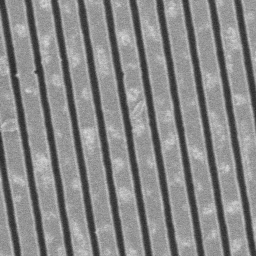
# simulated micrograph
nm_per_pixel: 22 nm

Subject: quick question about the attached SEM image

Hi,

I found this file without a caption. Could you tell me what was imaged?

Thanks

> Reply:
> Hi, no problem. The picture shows parallel lines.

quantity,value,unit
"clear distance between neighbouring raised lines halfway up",196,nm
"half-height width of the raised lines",372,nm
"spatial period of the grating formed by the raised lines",570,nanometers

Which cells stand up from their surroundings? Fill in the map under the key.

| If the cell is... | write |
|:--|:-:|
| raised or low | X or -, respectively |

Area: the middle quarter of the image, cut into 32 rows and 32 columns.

-XXXXX--XXXX---XXXX--XXXX---XXXX
--XXXX--XXXX---XXXX--XXXX---XXXX
--XXXX--XXXX---XXXX--XXXXX--XXXX
--XXXX--XXXXX--XXXX---XXXX--XXXX
--XXXX---XXXX--XXXX---XXXX--XXXX
--XXXX---XXXX--XXXXX--XXXX--XXXX
--XXXXX--XXXX---XXXX--XXXX---XXX
---XXXX--XXXX---XXXX--XXXX---XXX
---XXXX--XXXX---XXXX--XXXXX--XXX
X--XXXX--XXXXX--XXXX---XXXX--XXX
X--XXXX---XXXX--XXXX---XXXX--XXX
X--XXXX---XXXX--XXXXX--XXXX--XXX
X--XXXXX--XXXX---XXXX--XXXX---XX
X---XXXX--XXXX---XXXX--XXXX---XX
XX--XXXX--XXXX---XXXX--XXXXX--XX
XX--XXXX--XXXXX--XXXX--XXXXX--XX
XX--XXXX---XXXX--XXXX---XXXX--XX
XX--XXXX---XXXX--XXXXX--XXXX--XX
XX--XXXXX--XXXX---XXXX--XXXX---X
XX---XXXX--XXXX---XXXX--XXXX---X
XX---XXXX--XXXX---XXXX--XXXXX--X
XXX--XXXX--XXXXX--XXXX---XXXX--X
XXX--XXXX---XXXX--XXXX---XXXX--X
XXX--XXXX---XXXX--XXXXX--XXXX--X
XXX--XXXXX--XXXX---XXXX--XXXX---
XXX---XXXX--XXXX---XXXX--XXXX---
XXX---XXXX--XXXX---XXXX--XXXXX--
XXXX--XXXX--XXXXX--XXXX---XXXX--
XXXX--XXXX--XXXXX--XXXX---XXXX--
XXXX--XXXX---XXXX--XXXXX--XXXX--
XXXX--XXXXX--XXXX---XXXX--XXXX--
XXXX---XXXX--XXXX---XXXX--XXXX--